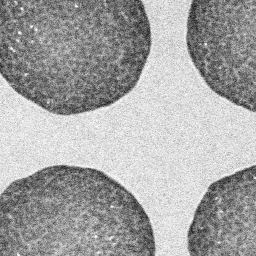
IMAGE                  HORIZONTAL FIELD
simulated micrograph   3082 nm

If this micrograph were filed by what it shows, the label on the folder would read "holes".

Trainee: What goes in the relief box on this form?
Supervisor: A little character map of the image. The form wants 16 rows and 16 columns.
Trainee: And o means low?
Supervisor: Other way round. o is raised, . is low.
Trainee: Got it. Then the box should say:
.........ooo....
.........ooo....
.........ooo....
.........ooo....
.........ooo....
o.......ooooo...
oo.....oooooooo.
oooooooooooooooo
oooooooooooooooo
oooooooooooooooo
ooo...ooooooooo.
o.......ooooo...
.........oooo...
.........ooo....
..........oo....
..........oo....